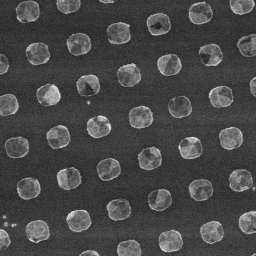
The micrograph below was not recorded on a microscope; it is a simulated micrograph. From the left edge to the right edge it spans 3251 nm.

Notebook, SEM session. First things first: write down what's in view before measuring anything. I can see a regular array of raised bodies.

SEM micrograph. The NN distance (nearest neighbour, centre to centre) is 529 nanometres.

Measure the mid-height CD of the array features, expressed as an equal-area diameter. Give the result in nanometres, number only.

288